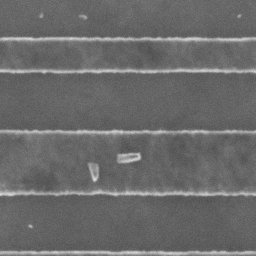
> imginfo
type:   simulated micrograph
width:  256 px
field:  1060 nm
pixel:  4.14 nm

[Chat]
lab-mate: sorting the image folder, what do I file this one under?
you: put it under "lines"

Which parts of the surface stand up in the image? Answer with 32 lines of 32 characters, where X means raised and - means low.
--------------------------------
--------------------------------
--------------------------------
--------------------------------
--------------------------------
XXXXXXXXXXXXXXXXXXXXXXXXXXXXXXXX
XXXXXXXXXXXXXXXXXXXXXXXXXXXXXXXX
XXXXXXXXXXXXXXXXXXXXXXXXXXXXXXXX
XXXXXXXXXXXXXXXXXXXXXXXXXXXXXXXX
--------------------------------
--------------------------------
--------------------------------
--------------------------------
--------------------------------
--------------------------------
--------------------------------
XXXXXXXXXXXXXXXXXXXXXXXXXXXXXXXX
XXXXXXXXXXXXXXXXXXXXXXXXXXXXXXXX
XXXXXXXXXXXXXXXXXXXXXXXXXXXXXXXX
XXXXXXXXXXXXXXXXXXXXXXXXXXXXXXXX
XXXXXXXXXXXXXXXXXXXXXXXXXXXXXXXX
XXXXXXXXXXXXXXXXXXXXXXXXXXXXXXXX
XXXXXXXXXXXXXXXXXXXXXXXXXXXXXXXX
XXXXXXXXXXXXXXXXXXXXXXXXXXXXXXXX
--------------------------------
--------------------------------
--------------------------------
--------------------------------
--------------------------------
--------------------------------
--------------------------------
XXXXXXXXXXXXXX-XXXXXX----------X